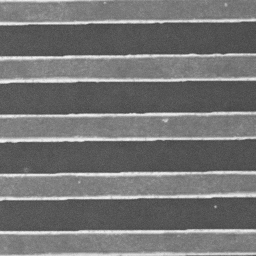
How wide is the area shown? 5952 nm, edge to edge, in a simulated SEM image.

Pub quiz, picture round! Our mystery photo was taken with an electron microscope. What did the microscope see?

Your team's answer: lines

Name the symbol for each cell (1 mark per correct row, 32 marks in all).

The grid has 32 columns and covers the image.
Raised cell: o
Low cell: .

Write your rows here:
oooooooooooooooooooooooooooooooo
oooooooooooooooooooooooooooooooo
oooooooooooooooooooooooooooooooo
................................
................................
................................
................................
oooooooooooooooooooooooooooooooo
oooooooooooooooooooooooooooooooo
oooooooooooooooooooooooooooooooo
................................
................................
................................
................................
oooooooooooooooooooooooooooooooo
oooooooooooooooooooooooooooooooo
oooooooooooooooooooooooooooooooo
oooooooooooooooooo..............
................................
................................
................................
..........................oooooo
oooooooooooooooooooooooooooooooo
oooooooooooooooooooooooooooooooo
oooooooooooooooooooooooooooooooo
................................
................................
................................
................................
oooooooooooooooooooooooooooooooo
oooooooooooooooooooooooooooooooo
oooooooooooooooooooooooooooooooo